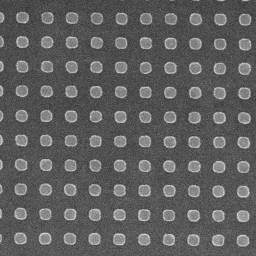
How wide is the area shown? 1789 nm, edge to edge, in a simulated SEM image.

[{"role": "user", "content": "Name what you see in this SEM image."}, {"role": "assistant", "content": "a regular array of raised bodies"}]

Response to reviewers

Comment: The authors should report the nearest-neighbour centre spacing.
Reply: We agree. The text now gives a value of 170 nm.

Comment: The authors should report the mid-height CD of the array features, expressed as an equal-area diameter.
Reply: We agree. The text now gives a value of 82.3 nanometres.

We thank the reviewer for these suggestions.